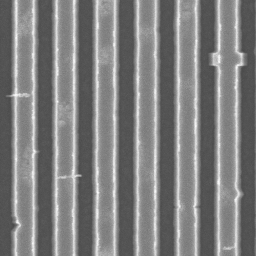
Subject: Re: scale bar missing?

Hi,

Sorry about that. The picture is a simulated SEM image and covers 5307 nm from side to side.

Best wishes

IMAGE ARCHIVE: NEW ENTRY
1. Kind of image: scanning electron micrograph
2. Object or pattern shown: parallel lines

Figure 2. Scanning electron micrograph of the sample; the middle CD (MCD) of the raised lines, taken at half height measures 464 nm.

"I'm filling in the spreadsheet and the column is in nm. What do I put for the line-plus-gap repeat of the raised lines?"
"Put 841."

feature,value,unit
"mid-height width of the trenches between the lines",0.368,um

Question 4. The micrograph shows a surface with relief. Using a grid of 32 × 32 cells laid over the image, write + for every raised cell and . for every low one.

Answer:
..++...+++..+++..+++..+++..+++..
..+++..+++..+++..+++..+++..+++..
..+++..+++..+++..+++..+++..+++..
..++...+++..+++..+++..+++..+++..
..++...++...+++..+++..+++..+++..
..+++..+++..+++..+++..+++..+++..
..++...+++..+++..+++..+++..+++..
..+++..+++..+++..+++..+++.++++..
..++...++...+++..+++..+++..+++..
..++...+++..+++..+++..+++..+++..
..+++..+++..+++..+++..+++..+++..
..++...+++..+++..+++..+++..+++..
..++...+++..+++..+++..+++..+++..
..++...+++..+++..+++..+++..+++..
..+++..+++..+++..+++..+++..+++..
..+++..+++..+++..+++..+++..+++..
..+++..+++..+++..+++..+++..+++..
..++...+++..+++..+++..+++..+++..
..+++..+++..+++..+++..+++..+++..
..+++..+++..+++..+++..+++..+++..
..++...+++..+++..+++..+++..+++..
..++...+++..+++..+++..+++..+++..
..++...+++..+++..+++..+++..+++..
..++...+++..+++..+++..+++..+++..
..++...+++..+++..+++..+++..+++..
..+++..+++..+++..+++..+++..+++..
..+++..+++..+++..+++..+++..+++..
..++...+++..+++..+++..+++..+++..
..++...+++..+++..+++..+++..+++..
..++...+++..+++..+++..+++..+++..
..+++..+++..+++..+++..+++..+++..
..+++..+++..+++..+++..+++..+++..